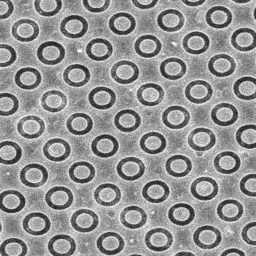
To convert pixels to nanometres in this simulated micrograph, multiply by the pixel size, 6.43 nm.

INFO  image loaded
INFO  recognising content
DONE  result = a regular array of ring-shaped grooves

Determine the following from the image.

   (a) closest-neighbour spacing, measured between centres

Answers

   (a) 0.218 micrometres